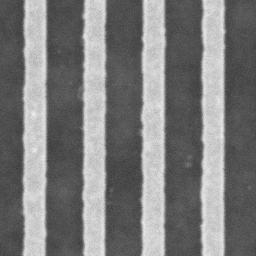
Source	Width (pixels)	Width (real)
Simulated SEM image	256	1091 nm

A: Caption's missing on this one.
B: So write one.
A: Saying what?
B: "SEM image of lines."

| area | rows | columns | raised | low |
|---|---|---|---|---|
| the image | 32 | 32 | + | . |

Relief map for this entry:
...+++.....++.....++.....+++....
...+++.....++.....++.....+++....
...+++.....++.....++.....+++....
...+++.....++.....+++....+++....
...+++.....++.....++.....+++....
...+++.....++.....+++....+++....
...+++.....++.....++.....+++....
...+++.....++.....++.....+++....
...+++.....++.....++.....+++....
...+++.....++.....++.....+++....
...+++.....++.....++.....+++....
...+++.....++.....++.....+++....
...+++.....++.....++.....+++....
...+++.....++.....++.....+++....
...+++.....++.....++.....+++....
...+++.....++.....++.....+++....
...+++.....++.....++.....+++....
...+++.....++.....++.....+++....
...+++.....++.....++......++....
...+++.....++.....++.....+++....
...+++.....++.....++.....+++....
...+++.....++.....++.....+++....
...+++.....++.....++.....+++....
...+++.....++.....++.....+++....
...+++....+++.....++.....+++....
...+++.....++.....++.....+++....
...+++....+++.....++.....+++....
...+++....+++.....++.....+++....
...+++.....++.....++.....+++....
...+++.....++.....++.....+++....
...+++.....++.....++.....+++....
...+++.....++.....++.....+++....